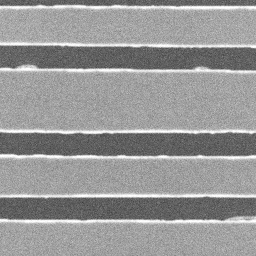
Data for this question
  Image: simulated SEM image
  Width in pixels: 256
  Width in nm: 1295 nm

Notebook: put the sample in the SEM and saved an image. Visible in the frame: lines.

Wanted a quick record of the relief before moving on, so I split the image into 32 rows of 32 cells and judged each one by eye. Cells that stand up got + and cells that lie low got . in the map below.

................................
++++++++++++++++++++++++++++++++
++++++++++++++++++++++++++++++++
++++++++++++++++++++++++++++++++
++++++++++++++++++++++++++++++++
++++++++++++++++++++++++++++++++
................................
................................
................................
++++++++++++++++++++++++++++++++
++++++++++++++++++++++++++++++++
++++++++++++++++++++++++++++++++
++++++++++++++++++++++++++++++++
++++++++++++++++++++++++++++++++
++++++++++++++++++++++++++++++++
++++++++++++++++++++++++++++++++
++++++++++++++++++++++++++++++++
................................
................................
++..++..........................
++++++++++++++++++++++++++++++++
++++++++++++++++++++++++++++++++
++++++++++++++++++++++++++++++++
++++++++++++++++++++++++++++++++
++++++++++++++++++++++++++++++++
................................
................................
+...............................
++++++++++++++++++++++++++++++++
++++++++++++++++++++++++++++++++
++++++++++++++++++++++++++++++++
++++++++++++++++++++++++++++++++